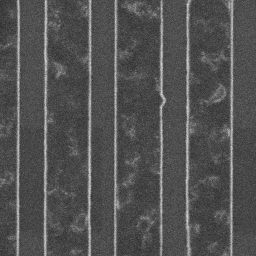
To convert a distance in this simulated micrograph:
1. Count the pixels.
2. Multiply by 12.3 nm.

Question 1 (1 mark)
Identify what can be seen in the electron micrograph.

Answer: one or a few lines or trenches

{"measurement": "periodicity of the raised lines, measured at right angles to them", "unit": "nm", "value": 872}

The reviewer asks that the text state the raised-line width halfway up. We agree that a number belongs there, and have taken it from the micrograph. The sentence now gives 551 nm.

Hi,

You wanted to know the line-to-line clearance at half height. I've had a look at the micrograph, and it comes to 316 nm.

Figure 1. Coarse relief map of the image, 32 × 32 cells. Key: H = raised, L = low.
HHLLLLHHHHHLLLHHHHHHLLLLHHHHHLLL
HHLLLLHHHHHLLLHHHHHHLLLHHHHHHLLL
HHLLLLHHHHHLLLHHHHHHLLLHHHHHHLLL
HHLLLLHHHHHLLLHHHHHHLLLLHHHHHLLL
HHLLLLHHHHHLLLHHHHHHLLLLHHHHHLLL
HHLLLLHHHHHLLLHHHHHHLLLLHHHHHLLL
HHLLLLHHHHHLLLHHHHHHLLLHHHHHHLLL
HHLLLLHHHHHLLLHHHHHHLLLHHHHHHLLL
HHLLLLHHHHHLLLHHHHHHLLLHHHHHHLLL
HHLLLLHHHHHLLLHHHHHHLLLHHHHHHLLL
HHLLLLHHHHHLLLHHHHHHLLLHHHHHHLLL
HHLLLLHHHHHLLLHHHHHHLLLHHHHHHLLL
HHLLLLHHHHHLLLHHHHHHLLLHHHHHHLLL
HHLLLLHHHHHLLLHHHHHHLLLHHHHHHLLL
HHLLLLHHHHHLLLHHHHHHLLLHHHHHHLLL
HHLLLLHHHHHLLLHHHHHHLLLHHHHHHLLL
HHLLLLHHHHHLLLHHHHHHLLLHHHHHHLLL
HHLLLLHHHHHLLLHHHHHHLLLHHHHHHLLL
HHLLLLHHHHHLLLHHHHHHLLLHHHHHHLLL
HHLLLLHHHHHLLLHHHHHHLLLHHHHHHLLL
HHLLLLHHHHHLLLHHHHHHLLLHHHHHHLLL
HHLLLLHHHHHLLLHHHHHHLLLHHHHHHLLL
HHLLLLHHHHHLLLHHHHHHLLLHHHHHHLLL
HHLLLLHHHHHLLLHHHHHHLLLHHHHHHLLL
HHLLLLHHHHHLLLHHHHHHLLLHHHHHHLLL
HHLLLLHHHHHLLLHHHHHHLLLHHHHHHLLL
HHLLLLHHHHHLLLHHHHHHLLLHHHHHHLLL
HHLLLLHHHHHLLLHHHHHHLLLHHHHHHLLL
HHLLLLHHHHHLLLHHHHHHLLLHHHHHHLLL
HHLLLLHHHHHLLLHHHHHHLLLLHHHHHLLL
HHLLLLHHHHHLLLHHHHHHLLLLHHHHHLLL
HHLLLLHHHHHLLLHHHHHHLLLLHHHHHLLL